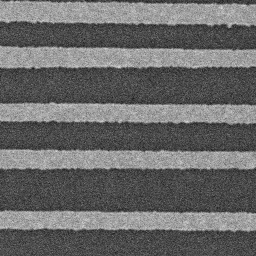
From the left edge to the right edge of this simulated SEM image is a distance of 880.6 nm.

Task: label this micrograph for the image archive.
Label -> lines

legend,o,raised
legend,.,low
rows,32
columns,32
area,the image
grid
oooooooooooooooooo..............
oooooooooooooooooooooooooooooooo
oooooooooooooooooooooooooooooooo
................................
................................
................................
oooooooooooooooooooooooooooooooo
oooooooooooooooooooooooooooooooo
................................
................................
................................
................................
................................
oooooooooooooooooooooooooooooooo
oooooooooooooooooooooooooooooooo
................................
................................
................................
................................
oooooooooooooooooooooooooooooooo
oooooooooooooooooooooooooooooooo
................................
................................
................................
................................
................................
ooooooooooooo..o.o.o............
oooooooooooooooooooooooooooooooo
oooooooooooooooooooooooooooooooo
................................
................................
................................